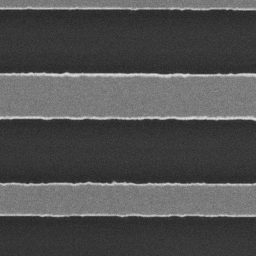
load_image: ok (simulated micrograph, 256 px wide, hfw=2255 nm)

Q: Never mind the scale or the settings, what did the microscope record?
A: lines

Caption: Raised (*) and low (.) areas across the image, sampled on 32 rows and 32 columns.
********************************
................................
................................
................................
................................
................................
................................
................................
................................
********************************
********************************
********************************
********************************
********************************
********************************
................................
................................
................................
................................
................................
................................
................................
................................
********************************
********************************
********************************
********************************
................................
................................
................................
................................
................................